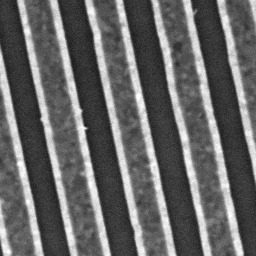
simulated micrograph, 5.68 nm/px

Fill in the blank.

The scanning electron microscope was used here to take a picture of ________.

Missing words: one or a few lines or trenches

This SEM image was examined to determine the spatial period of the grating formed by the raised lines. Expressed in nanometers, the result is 371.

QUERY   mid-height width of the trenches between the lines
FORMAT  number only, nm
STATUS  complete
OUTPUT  188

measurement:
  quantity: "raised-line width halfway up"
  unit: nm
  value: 183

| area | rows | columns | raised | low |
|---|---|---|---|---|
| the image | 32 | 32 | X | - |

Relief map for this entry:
---XXXX----XXXX----XXXX-----XXXX
---XXXX----XXXX-----XXXX----XXXX
---XXXX-----XXX-----XXXX----XXXX
---XXXX-----XXXX----XXXX----XXXX
---XXXXX----XXXX----XXXX-----XXX
----XXXX----XXXX----XXXX-----XXX
----XXXX----XXXX-----XXXX----XXX
----XXXX-----XXX-----XXXX----XXX
----XXXXX----XXXX----XXXX----XXX
----XXXXX----XXXX----XXXX-----XX
X----XXXX----XXXX----XXXXX----XX
X----XXXX----XXXX-----XXXX----XX
X----XXXX-----XXXX----XXXX----XX
X----XXXXX----XXXX----XXXX----XX
X----XXXXX----XXXX----XXXX-----X
XX----XXXX----XXXX-----XXXX----X
XX----XXXX-----XXX-----XXXX----X
XX----XXXX-----XXXX----XXXX----X
XX----XXXXX----XXXX----XXXX----X
XX-----XXXX----XXXX----XXXXX----
XXX----XXXX----XXXX-----XXXX----
XXX----XXXX-----XXX-----XXXX----
XXX----XXXX-----XXXX----XXXX----
XXX----XXXXX----XXXX----XXXX----
XXXX----XXXX----XXXX----XXXX----
XXXX----XXXX----XXXX-----XXXX---
XXXX----XXXX-----XXXX----XXXX---
XXXX----XXXX-----XXXX----XXXX---
XXXX----XXXXX----XXXX----XXXX---
XXXXX----XXXX----XXXX-----XXX---
-XXXX----XXXX----XXXX-----XXXX--
-XXXX----XXXX-----XXXX----XXXX--